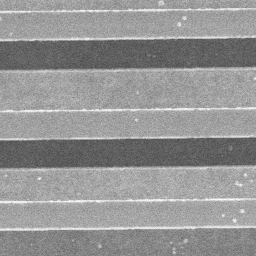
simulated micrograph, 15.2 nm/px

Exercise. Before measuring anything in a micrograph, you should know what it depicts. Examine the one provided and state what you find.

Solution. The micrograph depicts lines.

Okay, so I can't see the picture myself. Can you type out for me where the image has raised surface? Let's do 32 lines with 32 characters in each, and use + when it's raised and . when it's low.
++++++++++++++++++++++++++++++++
++++++++++++++++++++++++++++++++
++++++++++++++++++++++++++++++++
++++++++++++++++++++++++++++++++
++++++++++++++++++++++++++++++++
................................
................................
................................
................................
++++++++++++++++++++++++++++++++
++++++++++++++++++++++++++++++++
++++++++++++++++++++++++++++++++
++++++++++++++++++++++++++++++++
++++++++++++++++++++++++++++++++
++++++++++++++++++++++++++++++++
++++++++++++++++++++++++++++++++
++++++++++++++++++++++++++++++++
................................
................................
................................
................................
++++++++++++++++++++++++++++++++
++++++++++++++++++++++++++++++++
++++++++++++++++++++++++++++++++
++++++++++++++++++++++++++++++++
++++++++++++++++++++++++++++++++
++++++++++++++++++++++++++++++++
++++++++++++++++++++++++++++++++
+++++++++++++++++++++++.........
................................
................................
................................